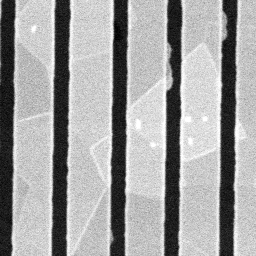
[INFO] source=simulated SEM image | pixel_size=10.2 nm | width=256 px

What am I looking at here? lines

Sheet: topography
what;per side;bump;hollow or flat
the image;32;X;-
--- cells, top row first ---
--XXXXX--XXXXX--XXXXX--XXXXX--XX
--XXXXX--XXXXX--XXXXX--XXXXX--XX
--XXXXX--XXXXX--XXXXX--XXXXX--XX
--XXXXX--XXXXX--XXXXX--XXXXX--XX
--XXXXX--XXXXX--XXXXX--XXXXX--XX
--XXXXX--XXXXX--XXXXX--XXXXX--XX
--XXXXX--XXXXX--XXXXX--XXXXX--XX
--XXXXX--XXXXX--XXXXX--XXXXX--XX
--XXXXX--XXXXX--XXXXX--XXXXX--XX
--XXXXX--XXXXX--XXXXX--XXXXX--XX
--XXXXX--XXXXX--XXXXX--XXXXX--XX
--XXXXX--XXXXX--XXXXX--XXXXX--XX
--XXXXX--XXXXX--XXXXX--XXXXX--XX
--XXXXX--XXXXX--XXXXX--XXXX---XX
--XXXXX--XXXXX--XXXXX--XXXX---XX
--XXXXX--XXXXX--XXXXX--XXXX---XX
--XXXXX--XXXXX--XXXXX--XXXX--XXX
--XXXXX--XXXXX--XXXXX-XXXXX--XXX
--XXXXX--XXXXX--XXXXX--XXXX--XXX
--XXXX---XXXXX--XXXXX--XXXX---XX
--XXXX--XXXXXX--XXXXX--XXXX---XX
--XXXX---XXXXX--XXXXX-XXXXX---XX
--XXXX--XXXXXX--XXXXX-XXXXX--XXX
--XXXX--XXXXXX--XXXXX-XXXXX--XXX
--XXXX--XXXXXX--XXXX--XXXXX--XXX
--XXXX--XXXXXX--XXXX--XXXXX--XXX
--XXXX--XXXXXX--XXXXX-XXXXX--XXX
--XXXX--XXXXXX--XXXXX-XXXXX--XXX
--XXXX--XXXXXX--XXXX--XXXXX--XXX
--XXXX--XXXXXX--XXXX--XXXXX--XXX
--XXXX--XXXXXX--XXXX--XXXXX--XXX
--XXXX--XXXXXX--XXXX--XXXXX--XXX